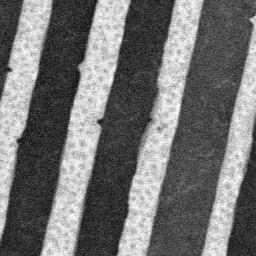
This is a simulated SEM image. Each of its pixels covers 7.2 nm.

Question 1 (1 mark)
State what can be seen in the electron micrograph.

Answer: one or a few lines or trenches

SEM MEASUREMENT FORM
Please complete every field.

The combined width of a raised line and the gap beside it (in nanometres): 544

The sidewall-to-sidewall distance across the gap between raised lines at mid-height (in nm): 328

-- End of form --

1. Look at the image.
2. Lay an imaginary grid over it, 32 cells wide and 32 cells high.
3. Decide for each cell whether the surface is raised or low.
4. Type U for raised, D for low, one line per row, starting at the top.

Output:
DDDUUUDDDDDDUUUUDDDDDDUUUDDDDDDD
DDDUUUDDDDDDUUUUDDDDDDUUUDDDDDDD
DDUUUUDDDDDDUUUUDDDDDUUUUDDDDDDU
DDUUUUDDDDDUUUUDDDDDDUUUUDDDDDDD
DDUUUUDDDDDUUUUDDDDDDUUUUDDDDDDU
DDUUUDDDDDDUUUUDDDDDDUUUDDDDDDDU
DUUUUDDDDDDUUUUDDDDDUUUUDDDDDDDU
DUUUUDDDDDUUUUUDDDDDUUUUDDDDDDDU
DUUUUDDDDDUUUUUDDDDDUUUUDDDDDDDU
DUUUUDDDDDUUUUDDDDDDUUUDDDDDDDUU
DUUUDDDDDDUUUUDDDDDDUUUDDDDDDDUU
UUUUDDDDDDUUUUDDDDDDUUUDDDDDDDUU
UUUUDDDDDUUUUDDDDDDDUUUDDDDDDDUU
UUUUDDDDDUUUUDDDDDDUUUUDDDDDDUUU
UUUDDDDDDUUUUDDDDDDUUUDDDDDDDUUU
UUUDDDDDDUUUDDDDDDDUUUDDDDDDDUUU
UUUDDDDDUUUUUDDDDDUUUUDDDDDDDUUU
UUDDDDDDUUUUDDDDDDUUUUDDDDDDDUUD
UUDDDDDDUUUUDDDDDDUUUDDDDDDDUUUD
UUDDDDDDUUUUDDDDDUUUUDDDDDDDUUUD
UUDDDDDDUUUUDDDDDUUUUDDDDDDDUUUD
UUDDDDDDUUUDDDDDDUUUUDDDDDDDUUDD
UUDDDDDUUUUDDDDDDUUUDDDDDDDUUUDD
UDDDDDDUUUUDDDDDUUUUDDDDDDDUUUDD
UDDDDDDUUUUDDDDDUUUUDDDDDDDUUUDD
UDDDDDDUUUDDDDDDUUUUDDDDDDDUUDDD
UDDDDDUUUUDDDDDDUUUDDDDDDDDUUDDD
UDDDDDUUUUDDDDDDUUUDDDDDDDUUUDDD
DDDDDDUUUUDDDDDUUUUDDDDDDDUUUDDD
DDDDDDUUUUDDDDDUUUUDDDDDDDUUUDDD
DDDDDUUUUDDDDDDUUUUDDDDDDDUUDDDD
DDDDDUUUUDDDDDDUUUDDDDDDDUUUDDDD